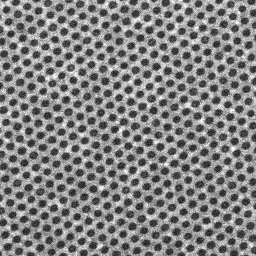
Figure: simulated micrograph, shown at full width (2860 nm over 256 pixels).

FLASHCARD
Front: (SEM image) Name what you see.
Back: a regular array of holes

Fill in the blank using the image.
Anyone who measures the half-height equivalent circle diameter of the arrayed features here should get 96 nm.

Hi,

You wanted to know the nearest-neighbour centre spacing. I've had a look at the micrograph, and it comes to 133 nm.